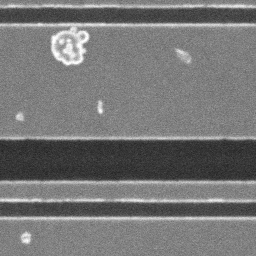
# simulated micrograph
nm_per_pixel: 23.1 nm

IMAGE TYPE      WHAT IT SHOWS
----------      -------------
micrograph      lines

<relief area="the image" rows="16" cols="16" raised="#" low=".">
################
################
################
################
################
################
################
################
################
................
................
################
################
################
################
################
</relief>